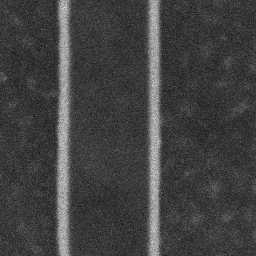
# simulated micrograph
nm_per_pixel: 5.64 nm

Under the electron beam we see one or a few lines or trenches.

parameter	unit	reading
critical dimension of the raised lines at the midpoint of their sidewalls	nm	520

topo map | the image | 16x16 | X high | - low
----XXXXXX------
----XXXXXX------
----XXXXXX------
----XXXXXX------
----XXXXXX------
----XXXXXX------
----XXXXXX------
----XXXXXX------
----XXXXXX------
----XXXXXX------
----XXXXXX------
----XXXXXX------
----XXXXXX------
----XXXXXX------
----XXXXXX------
----XXXXXX------